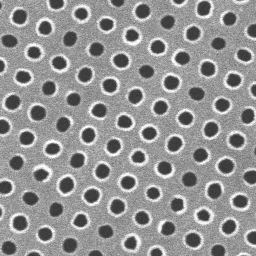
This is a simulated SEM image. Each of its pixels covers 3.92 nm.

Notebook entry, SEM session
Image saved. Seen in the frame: a regular array of holes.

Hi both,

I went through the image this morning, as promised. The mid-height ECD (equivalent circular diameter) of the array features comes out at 0.0547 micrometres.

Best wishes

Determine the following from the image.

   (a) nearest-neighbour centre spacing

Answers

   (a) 105 nm